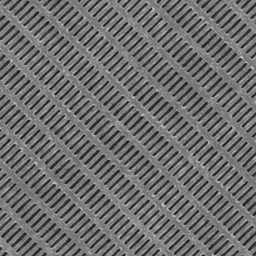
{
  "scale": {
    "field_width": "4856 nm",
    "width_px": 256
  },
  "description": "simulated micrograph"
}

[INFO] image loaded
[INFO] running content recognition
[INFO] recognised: a regular array of holes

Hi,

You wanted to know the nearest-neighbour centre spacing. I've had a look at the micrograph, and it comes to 133 nanometers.